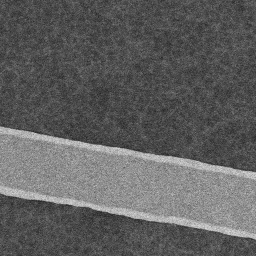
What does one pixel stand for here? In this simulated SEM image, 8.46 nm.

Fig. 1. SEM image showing one or a few lines or trenches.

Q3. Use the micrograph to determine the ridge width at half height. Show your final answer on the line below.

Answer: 59.2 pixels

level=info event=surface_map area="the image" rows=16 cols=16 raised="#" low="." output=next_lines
................
................
................
................
................
................
................
................
##..............
########........
#############...
################
...#############
.........#######
..............##
................